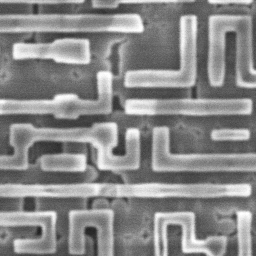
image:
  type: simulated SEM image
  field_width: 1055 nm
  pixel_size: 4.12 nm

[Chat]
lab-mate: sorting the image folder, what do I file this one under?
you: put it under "wiring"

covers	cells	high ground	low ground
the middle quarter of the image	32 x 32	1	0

00000000000000000000000000000111
00000000000000000000000000000111
00000000011000001111111111111111
00000000011100011111111111111111
00000000011100011111111111111111
00000000011100000000000000010000
00000000011100000000000000000000
00000000011100000000000000000000
11110000011100000000000000000000
11111111111100011111111111111111
11111111111100011111111111111111
11111111111100001111111111111111
11110000000000000000000000000001
01100000000000000000000000000000
00000000000000000000000000000000
00000001111110000000000000000000
11111111111110001100000111000000
11111111111110001110001111000000
11111111111110001110001111000000
00000011111110011110001111000000
00000000111110001110001111000000
00000000011100001110001111000000
00000000011100011110001111000000
11111000011111111110001111111111
11111000011111111110001111111111
11111000011111111110001111111111
11111000000000000000000100111101
00000000000000000000000000000000
00000000000000000000000000000000
00000000000000000000000000000000
11111111100001111111111111111111
11111111100111111111111111111111